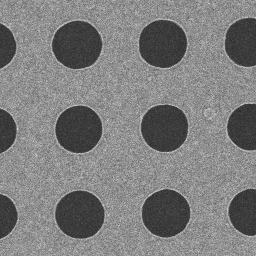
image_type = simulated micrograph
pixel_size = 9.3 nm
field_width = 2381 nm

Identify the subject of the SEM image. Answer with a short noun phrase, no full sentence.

holes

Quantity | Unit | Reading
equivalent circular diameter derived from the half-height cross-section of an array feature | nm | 450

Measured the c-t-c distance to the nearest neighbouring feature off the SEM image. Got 785 nanometers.